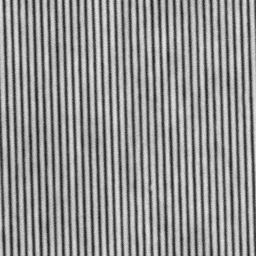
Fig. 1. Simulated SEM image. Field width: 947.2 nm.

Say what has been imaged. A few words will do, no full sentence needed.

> parallel lines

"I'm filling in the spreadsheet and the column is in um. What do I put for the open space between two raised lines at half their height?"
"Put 0.0106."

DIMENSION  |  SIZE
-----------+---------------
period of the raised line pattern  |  27.4 nanometres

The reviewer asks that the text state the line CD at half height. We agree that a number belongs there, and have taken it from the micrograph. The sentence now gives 0.0171 microns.